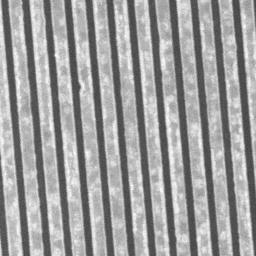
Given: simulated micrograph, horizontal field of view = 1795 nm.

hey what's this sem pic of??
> parallel lines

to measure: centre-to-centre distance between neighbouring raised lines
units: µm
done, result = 0.147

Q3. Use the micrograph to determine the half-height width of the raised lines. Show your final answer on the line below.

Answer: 87.2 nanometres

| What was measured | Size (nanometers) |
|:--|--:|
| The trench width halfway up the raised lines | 61.9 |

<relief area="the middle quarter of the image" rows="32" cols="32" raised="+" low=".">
+...++...+++..+++..+++..+++...++
+...+++..+++..+++..+++...++...++
+...+++..+++..+++..+++...+++..++
+...+++..+++..+++..+++...+++..++
+...+++..+++..+++..+++...+++..++
++..+++..+++..+++...++...+++..++
++..+++..+++..+++...+++..+++..++
++..+++..+++..++++..+++..+++..++
++..+++...++...+++..+++..+++..++
++..+++...+++..+++..+++..+++...+
++..+++...+++..+++..+++..+++...+
++..+++...+++..+++..+++..+++...+
++...+++..+++..+++..+++..+++...+
++...+++..+++..+++..+++...++...+
++...+++..+++..+++...++...+++..+
++...+++..+++..+++...++...+++..+
+++..+++..+++..+++...++...+++..+
+++..+++..+++..+++...++...+++..+
+++..+++..+++..+++...+++..+++..+
+++..+++...++...+++..+++..+++..+
+++..+++..+++...+++..+++..+++..+
+++..+++...++...+++..+++..+++..+
+++..+++...+++..+++..+++..+++..+
+++...++...+++..+++..+++..+++...
+++...+++..+++..+++..+++...++...
+++...+++..+++..+++..+++...+++..
+++...+++..+++..+++..+++...+++..
.++...+++..+++..+++...++...+++..
.+++..+++..+++..+++...++...+++..
.+++..+++..+++..+++...+++..+++..
.+++..+++..+++...+++..+++..+++..
.+++..+++...++...+++..+++..+++..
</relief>